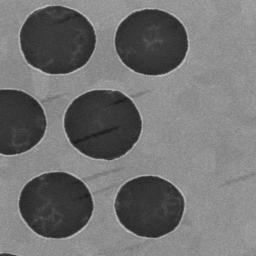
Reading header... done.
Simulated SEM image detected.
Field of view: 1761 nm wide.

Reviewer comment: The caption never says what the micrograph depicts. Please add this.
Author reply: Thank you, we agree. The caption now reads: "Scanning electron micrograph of holes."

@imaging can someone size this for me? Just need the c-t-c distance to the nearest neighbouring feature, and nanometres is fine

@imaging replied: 643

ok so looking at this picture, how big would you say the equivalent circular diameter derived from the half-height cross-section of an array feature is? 488 nm